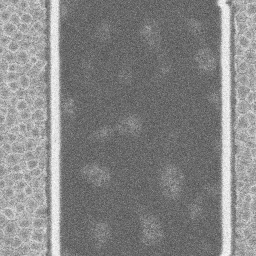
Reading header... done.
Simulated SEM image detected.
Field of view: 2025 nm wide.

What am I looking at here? one or a few lines or trenches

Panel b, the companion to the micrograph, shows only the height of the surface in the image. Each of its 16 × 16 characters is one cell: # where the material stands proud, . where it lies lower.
...###########..
...###########..
...###########..
...###########..
...###########..
...###########..
...###########..
...###########..
...###########..
...###########..
...###########..
...###########..
...###########..
...###########..
...###########..
...###########..